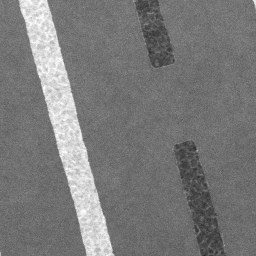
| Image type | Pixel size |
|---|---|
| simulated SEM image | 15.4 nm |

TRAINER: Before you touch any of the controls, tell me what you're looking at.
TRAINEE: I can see one or a few lines or trenches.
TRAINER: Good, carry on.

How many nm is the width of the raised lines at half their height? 342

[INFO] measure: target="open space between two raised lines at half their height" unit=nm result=1310